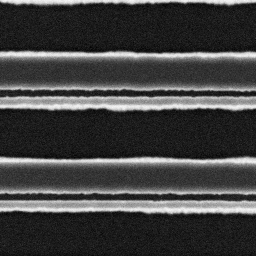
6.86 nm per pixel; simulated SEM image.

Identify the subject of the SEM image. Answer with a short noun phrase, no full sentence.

lines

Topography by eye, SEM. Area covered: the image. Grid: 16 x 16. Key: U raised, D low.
DDDDDDDDDDDDDDDD
DDDDDDDDDDDDDDDD
DDDDDDDDDDDDDDDD
UUUUUUUUUUUUUUUU
UUUUUUUUUUUUUUUU
UUUUUUUUUUUUUUUU
UUUUUUUUUUUUUUUU
DDDDDDDDDDDDDDDD
DDDDDDDDDDDDDDDD
DDDDDDDDDDDDDDDD
UUUUUUUUUUUUUUUU
UUUUUUUUUUUUUUUU
UUUUUUUUUUUUUUUU
DDDDDDDDDDDDDDDD
DDDDDDDDDDDDDDDD
DDDDDDDDDDDDDDDD